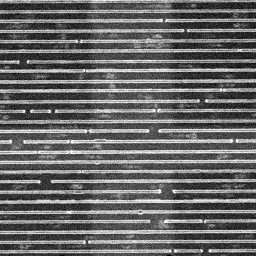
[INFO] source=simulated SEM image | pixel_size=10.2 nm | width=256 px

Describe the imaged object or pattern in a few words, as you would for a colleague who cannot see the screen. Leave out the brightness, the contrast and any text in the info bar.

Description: parallel lines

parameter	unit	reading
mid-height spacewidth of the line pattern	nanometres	78.1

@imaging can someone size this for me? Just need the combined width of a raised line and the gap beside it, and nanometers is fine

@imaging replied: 102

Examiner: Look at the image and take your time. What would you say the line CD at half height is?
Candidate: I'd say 25.6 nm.